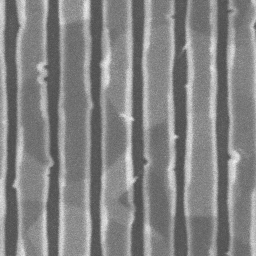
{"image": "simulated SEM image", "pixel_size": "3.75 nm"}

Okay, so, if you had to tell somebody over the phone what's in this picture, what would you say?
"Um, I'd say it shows parallel lines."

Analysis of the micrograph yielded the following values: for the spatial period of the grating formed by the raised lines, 0.158 µm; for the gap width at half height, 55.7 nanometers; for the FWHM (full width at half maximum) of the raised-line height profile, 104 nanometres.